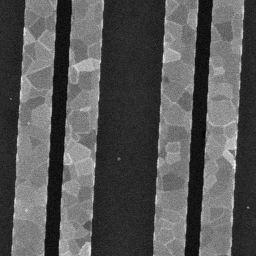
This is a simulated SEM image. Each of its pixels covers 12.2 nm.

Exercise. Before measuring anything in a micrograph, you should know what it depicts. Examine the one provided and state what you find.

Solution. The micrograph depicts lines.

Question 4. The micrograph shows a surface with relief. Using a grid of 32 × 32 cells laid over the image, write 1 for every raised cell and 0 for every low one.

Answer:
00011110011110000000011110011100
00011110011110000000011110011100
00011110011110000000011110111100
00011110011110000000011110111100
00011110011110000000011100111100
00011110011110000000011100111100
00011110011110000000111100111100
00011110011110000000111100111100
00011110011100000000111100111100
00011110011100000000111100111100
00011110111100000000111100111100
00011110111100000000111100111100
00011100111100000000111100111100
00111100111100000000111100111100
00111100111100000000111100111100
00111100111100000000111100111100
00111100111100000000111100111100
00111100111100000000111100111100
00111100111100000000111100111000
00111100111100000000111100111000
00111100111100000000111100111000
00111100111100000000111100111000
00111100111100000000111100111000
00111100111100000000111001111000
00111100111100000000111001111000
00111100111100000000111001111000
00111100111000000001111001111000
00111100111000000001111001111000
00111100111000000001111001111000
00111100111000000001111001111000
00111001111000000001111001111000
00111001111000000001111001111000